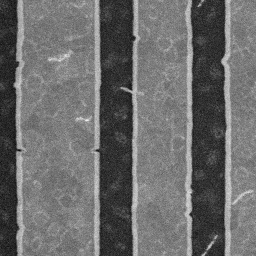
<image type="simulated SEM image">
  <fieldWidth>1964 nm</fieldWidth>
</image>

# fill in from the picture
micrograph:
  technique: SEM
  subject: one or a few lines or trenches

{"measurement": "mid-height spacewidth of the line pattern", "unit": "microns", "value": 0.289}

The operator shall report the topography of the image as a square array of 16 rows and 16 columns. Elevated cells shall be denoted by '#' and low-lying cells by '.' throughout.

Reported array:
.#####...###..##
.#####...###..##
.#####...###..##
.#####..####..##
.#####..####..##
.#####..####..##
.#####..####..##
.#####..####..##
.#####..####..##
.#####..####..##
.#####..####..##
.#####..####..##
.#####..####..##
.#####..####..##
.#####..####..##
.#####..####..##